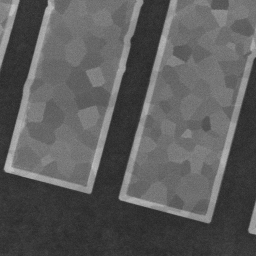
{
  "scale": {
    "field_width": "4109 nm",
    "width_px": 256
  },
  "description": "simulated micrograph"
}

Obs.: one or a few lines or trenches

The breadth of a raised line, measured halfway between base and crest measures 1370 nanometers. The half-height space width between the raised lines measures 0.549 um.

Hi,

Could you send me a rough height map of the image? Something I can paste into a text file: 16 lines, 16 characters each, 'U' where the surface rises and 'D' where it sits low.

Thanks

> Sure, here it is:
UDDUUUUUUDDUUUUU
UDDUUUUUDDUUUUUU
DDDUUUUUDDUUUUUU
DDUUUUUUDDUUUUUU
DDUUUUUUDDUUUUUD
DDUUUUUDDUUUUUUD
DUUUUUUDDUUUUUUD
DUUUUUUDDUUUUUUD
DUUUUUDDDUUUUUDD
DUUUUUDDUUUUUUDD
DUUUUUDDUUUUUUDD
DDDDUUDDUUUUUUDD
DDDDDDDDUUUUUDDD
DDDDDDDDDDDDUDDD
DDDDDDDDDDDDDDDD
DDDDDDDDDDDDDDDD